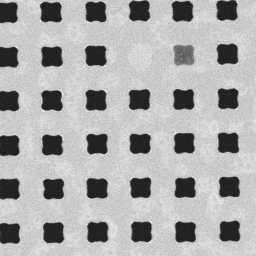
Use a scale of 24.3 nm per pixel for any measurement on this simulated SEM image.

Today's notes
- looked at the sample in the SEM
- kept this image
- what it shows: a regular array of holes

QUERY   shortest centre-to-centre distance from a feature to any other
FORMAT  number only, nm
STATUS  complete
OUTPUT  1060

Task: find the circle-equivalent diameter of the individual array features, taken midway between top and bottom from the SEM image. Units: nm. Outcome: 538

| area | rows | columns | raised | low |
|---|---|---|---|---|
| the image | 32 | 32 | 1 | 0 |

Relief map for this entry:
00111001111001110001110011100011
00111000111001110001110011100011
00111000111001111011110011100111
11111111111111111111111111111111
11111111111111111111111111111111
11111111111111111111111111110111
00111000111001111111111111100011
00111000111001111111111111100011
11111111111111111111111111111111
11111111111111111111111111111111
11111111111111111111111111111111
00111000111001110001110011100011
00111000111001110001110011100011
00111000111001110011110011110011
11111111111111111111111111111111
11111111111111111111111111111111
11111111111111111111111111111111
00111000111001110001110011100011
00111000111001110001110011100011
11111111111111111111111111111111
11111111111111111111111111111111
11111111111111111111111111111111
00111100111001111001110011110011
00111000111001110001110011100011
00111000111001111001110011110011
11111111111111111111111111111111
11111111111111111111111111111111
11111111111111111111111111111111
00111000111000110001110011100011
00111000111000110001110011100011
11111111111111111111111111111111
11111111111111111111111111111111